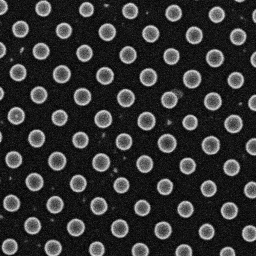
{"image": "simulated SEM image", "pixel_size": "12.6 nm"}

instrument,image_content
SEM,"a regular array of raised bodies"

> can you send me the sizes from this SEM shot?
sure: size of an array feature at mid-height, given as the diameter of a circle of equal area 0.197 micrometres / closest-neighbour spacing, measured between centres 385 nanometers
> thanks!